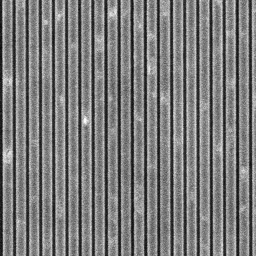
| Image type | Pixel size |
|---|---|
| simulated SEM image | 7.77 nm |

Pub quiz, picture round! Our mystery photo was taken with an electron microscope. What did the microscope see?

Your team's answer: parallel lines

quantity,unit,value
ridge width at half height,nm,72.8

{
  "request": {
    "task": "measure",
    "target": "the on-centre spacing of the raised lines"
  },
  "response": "102 nanometers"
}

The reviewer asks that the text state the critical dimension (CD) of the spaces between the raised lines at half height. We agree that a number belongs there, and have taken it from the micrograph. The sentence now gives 3.75 px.